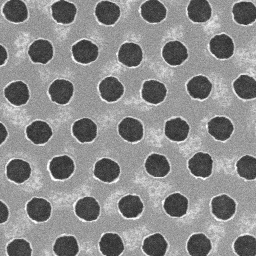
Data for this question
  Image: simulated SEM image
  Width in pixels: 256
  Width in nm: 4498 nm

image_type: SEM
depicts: a regular array of holes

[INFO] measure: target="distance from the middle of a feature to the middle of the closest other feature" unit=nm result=757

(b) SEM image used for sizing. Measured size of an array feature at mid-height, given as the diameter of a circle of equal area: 440 nanometres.